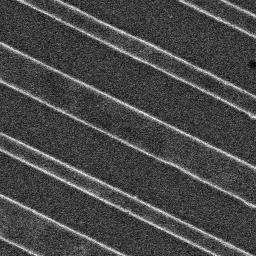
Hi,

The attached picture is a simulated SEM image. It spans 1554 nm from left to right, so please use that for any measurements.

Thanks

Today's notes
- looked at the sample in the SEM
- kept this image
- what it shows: one or a few lines or trenches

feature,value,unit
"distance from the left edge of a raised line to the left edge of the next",434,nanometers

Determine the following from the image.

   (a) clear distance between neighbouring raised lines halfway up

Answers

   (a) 0.278 um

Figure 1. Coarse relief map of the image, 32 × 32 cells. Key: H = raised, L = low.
LLLHHHHHLLLLLLLLLLLLLLLHHHHHHLLL
LLLLLHHHHHLLLLLLLLLLLLLLLHHHHHHL
LLLLLLLHHHHHLLLLLLLLLLLLLLLHHHHH
LLLLLLLLLHHHHHLLLLLLLLLLLLLLLLHH
LLLLLLLLLLLHHHHHLLLLLLLLLLLLLLLL
LLLLLLLLLLLLLLHHHHHLLLLLLLLLLLLL
HHLLLLLLLLLLLLLHHHHHHLLLLLLLLLLL
HHHHLLLLLLLLLLLLLLHHHHHLLLLLLLLL
HHHHHHHLLLLLLLLLLLLLHHHHHLLLLLLL
HHHHHHHHHLLLLLLLLLLLLLHHHHHLLLLL
LHHHHHHHHHHLLLLLLLLLLLLLHHHHHLLL
LLLHHHHHHHHHHLLLLLLLLLLLLLHHHHHL
LLLLLHHHHHHHHHHLLLLLLLLLLLLLHHHH
LLLLLLLHHHHHHHHHHLLLLLLLLLLLLLHH
LLLLLLLLLHHHHHHHHHHLLLLLLLLLLLLL
LLLLLLLLLLLHHHHHHHHHHLLLLLLLLLLL
LLLLLLLLLLLLLHHHHHHHHHHLLLLLLLLL
HHLLLLLLLLLLLLLHHHHHHHHHHLLLLLLL
HHHHLLLLLLLLLLLLLHHHHHHHHHHLLLLL
LLHHHHLLLLLLLLLLLLLHHHHHHHHHHLLL
LLLLHHHHLLLLLLLLLLLLLHHHHHHHHHHL
LLLLLLHHHHLLLLLLLLLLLLLHHHHHHHHH
LLLLLLLLHHHHLLLLLLLLLLLLLHHHHHHH
LLLLLLLLLLHHHHLLLLLLLLLLLLLHHHHH
LLLLLLLLLLLLHHHHLLLLLLLLLLLLLHHH
HHLLLLLLLLLLLLHHHHLLLLLLLLLLLLLH
HHHHLLLLLLLLLLLLHHHHLLLLLLLLLLLL
HHHHHHLLLLLLLLLLLLHHHHLLLLLLLLLL
HHHHHHHHLLLLLLLLLLLLHHHHLLLLLLLL
HHHHHHHHHHHLLLLLLLLLLLHHHHLLLLLL
LLHHHHHHHHHHHLLLLLLLLLLLHHHHHLLL
LLLLHHHHHHHHHHHLLLLLLLLLLLHHHHHL